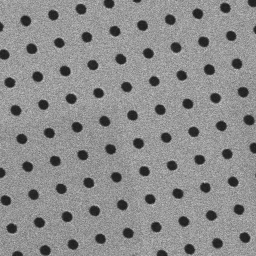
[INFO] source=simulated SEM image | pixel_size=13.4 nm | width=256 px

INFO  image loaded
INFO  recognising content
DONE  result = a regular array of holes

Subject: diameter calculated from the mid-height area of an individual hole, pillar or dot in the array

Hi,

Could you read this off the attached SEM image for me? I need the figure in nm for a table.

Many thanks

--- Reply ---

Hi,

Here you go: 144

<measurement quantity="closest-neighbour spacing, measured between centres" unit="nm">376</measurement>